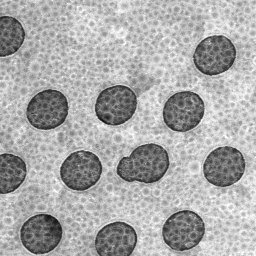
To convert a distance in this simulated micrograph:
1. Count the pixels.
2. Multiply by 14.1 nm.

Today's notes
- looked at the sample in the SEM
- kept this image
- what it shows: a regular array of holes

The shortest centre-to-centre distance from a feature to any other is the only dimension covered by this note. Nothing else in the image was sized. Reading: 926 nanometers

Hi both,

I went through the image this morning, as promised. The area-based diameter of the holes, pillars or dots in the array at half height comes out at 588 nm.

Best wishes